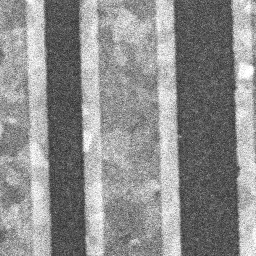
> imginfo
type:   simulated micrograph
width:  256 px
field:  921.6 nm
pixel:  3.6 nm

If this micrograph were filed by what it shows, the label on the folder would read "one or a few lines or trenches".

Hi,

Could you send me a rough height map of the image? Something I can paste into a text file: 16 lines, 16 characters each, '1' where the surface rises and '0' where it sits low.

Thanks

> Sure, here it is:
1100001111000001
1100001111000001
1100001111000001
1100001111000001
1100001111000001
1100001111000001
1100001111000001
1100001111000001
1100001111000001
1100001111100001
1100001111100001
1110001111100001
1110001111100001
1110001111100001
1110001111100000
1110001111100000